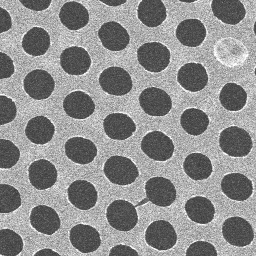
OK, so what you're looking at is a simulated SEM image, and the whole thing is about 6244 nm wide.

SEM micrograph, a regular array of holes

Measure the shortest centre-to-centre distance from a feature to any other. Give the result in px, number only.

43.8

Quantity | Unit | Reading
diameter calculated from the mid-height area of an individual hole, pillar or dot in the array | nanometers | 740